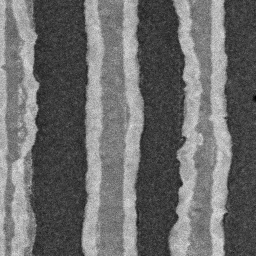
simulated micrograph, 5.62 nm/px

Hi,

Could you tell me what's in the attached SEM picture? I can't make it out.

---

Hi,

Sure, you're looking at one or a few lines or trenches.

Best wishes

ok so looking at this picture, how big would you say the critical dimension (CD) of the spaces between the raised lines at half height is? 351 nanometres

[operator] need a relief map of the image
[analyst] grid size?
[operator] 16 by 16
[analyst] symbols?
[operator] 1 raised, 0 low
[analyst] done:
1000001100011100
1000001100001100
1100001100001100
1100001100001100
1100001100001100
1100001100001100
1100001100001100
1100001100001100
1100001100001100
1100001100001100
1000001100001100
1000001100001100
1000001100001100
1000001100011000
1000001100011100
1000001100011100